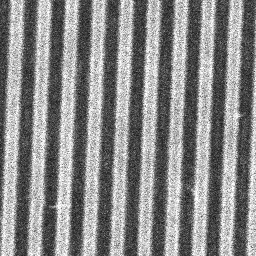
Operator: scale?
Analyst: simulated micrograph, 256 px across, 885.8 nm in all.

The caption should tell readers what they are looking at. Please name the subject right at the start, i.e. parallel lines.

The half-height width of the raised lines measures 43.2 nanometres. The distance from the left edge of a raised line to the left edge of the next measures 27.3 px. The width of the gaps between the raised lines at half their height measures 49.6 nanometers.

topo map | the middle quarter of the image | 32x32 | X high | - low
XXX----XXX---XXXX---XXX----XXX--
XXX----XXX---XXXX---XXX----XXX--
XXX----XXX---XXX----XXX----XXX--
XXX----XXX---XXX----XXX----XXX--
XXX----XX----XXX----XXX----XXX--
XXX----XX----XXX----XXX----XXX--
XX-----XX----XXX----XXX----XXX--
XXX---XXXX---XXX----XXX----XXX--
XXX---XXX----XXX----XXX----XXX--
XXX---XXX----XXX----XXX----XXX--
XXX---XXX----XXX----XXX----XXX--
XXX---XXX----XXX----XXX----XXX--
XX----XXX----XXX----XXX----XXX--
XX----XXX----XXX----XXX----XXX--
XX----XXX----XXX----XXX----XXX--
XX----XXX----XXX----XXX---XXXX--
XX----XXX----XXX----XXX---XXXX--
XX----XXX----XXX----XXX---XXXX--
XX----XXX----XXX----XXX---XXX---
XX----XXX----XXX----XXX---XXX---
XX----XXX----XXX----XXX----XX---
XX----XXX----XXX----XXX---XXX---
XX----XXX----XXX---XXXX---XXX---
XX----XXX----XXX---XXXX---XXX---
XX----XXX---XXXX---XXXX---XXX---
XX----XXX---XXXX---XXX----XXX---
XX----XXX---XXXX---XXX----XXX---
XX---XXXX---XXX----XXX----XXX---
XX----XXX----XX----XXX----XXX---
XX----XX----XXX----XXX----XXX---
XX---XXX----XXX----XXX----XXX---
XX---XXXX---XXX----XXX----XXX---